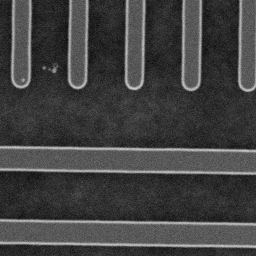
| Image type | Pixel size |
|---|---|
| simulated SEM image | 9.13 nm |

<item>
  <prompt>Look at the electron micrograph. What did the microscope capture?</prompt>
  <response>groups of lines, slits or small figures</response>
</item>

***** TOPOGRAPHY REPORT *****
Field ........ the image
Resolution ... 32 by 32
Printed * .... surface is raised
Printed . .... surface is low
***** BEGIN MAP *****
..**.....**.....**.....**.....**
..**.....**.....**.....**.....**
..**.....**.....**.....**.....**
..**.....**.....**.....**.....**
..**.....**.....**.....**.....**
..**.....**.....**.....**.....**
..**.....**.....**.....**.....**
..**.....**.....**.....**.....**
..**.....**.....**.....**.....**
..**.....**.....**.....**.....**
..*......**.....**.....**.....**
................................
................................
................................
................................
................................
................................
................................
*********.......................
********************************
********************************
.......................*********
................................
................................
................................
................................
................................
................................
********************************
********************************
..........**********************
................................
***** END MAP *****